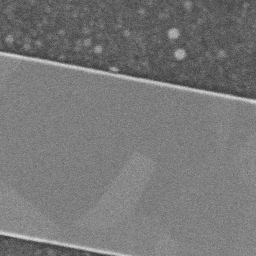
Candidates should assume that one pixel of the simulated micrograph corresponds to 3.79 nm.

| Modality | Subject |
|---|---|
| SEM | one or a few lines or trenches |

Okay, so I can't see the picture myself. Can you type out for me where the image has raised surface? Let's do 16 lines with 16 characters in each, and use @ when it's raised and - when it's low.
----------------
----------------
----------------
@---------------
@@@@@@----------
@@@@@@@@@@@@----
@@@@@@@@@@@@@@@@
@@@@@@@@@@@@@@@@
@@@@@@@@@@@@@@@@
@@@@@@@@@@@@@@@@
@@@@@@@@@@@@@@@@
@@@@@@@@@@@@@@@@
@@@@@@@@@@@@@@@@
@@@@@@@@@@@@@@@@
@@@@@@@@@@@@@@@@
-----@@@@@@@@@@@